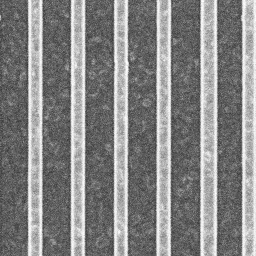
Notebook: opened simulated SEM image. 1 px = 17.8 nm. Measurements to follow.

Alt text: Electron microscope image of parallel lines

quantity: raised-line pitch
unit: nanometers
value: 769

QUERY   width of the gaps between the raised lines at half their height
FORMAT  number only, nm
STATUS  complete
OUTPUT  542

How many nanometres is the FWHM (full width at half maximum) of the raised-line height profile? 226